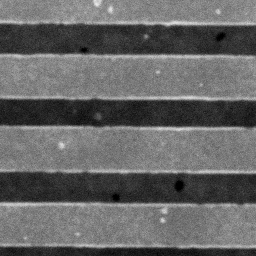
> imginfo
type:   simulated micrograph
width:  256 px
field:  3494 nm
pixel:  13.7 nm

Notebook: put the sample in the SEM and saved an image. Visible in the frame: lines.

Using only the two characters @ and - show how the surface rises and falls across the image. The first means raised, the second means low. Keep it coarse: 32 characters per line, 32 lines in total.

@@@@@@@@@@@@@@@@@@@@@@@@@@@@@@@@
@@@@@@@@@@@@@@@@@@@@@@@@@@@@@@@@
@@@@@@@@@@@@@@@@@@@@@@@@@@@@@@@@
--------------------------------
--------------------------------
--------------------------------
--------------------------------
@@@@@@@@@@@@@@@@@@@@@@@@@@@@@@@@
@@@@@@@@@@@@@@@@@@@@@@@@@@@@@@@@
@@@@@@@@@@@@@@@@@@@@@@@@@@@@@@@@
@@@@@@@@@@@@@@@@@@@@@@@@@@@@@@@@
@@@@@@@@@@@@@@@@@@@@@@@@@@@@@@@@
--------------------------------
--------------------------------
--------------------------------
--------------------------------
@@@@@@@@@@@@@@@@@@@@@@@@@@@@@@@@
@@@@@@@@@@@@@@@@@@@@@@@@@@@@@@@@
@@@@@@@@@@@@@@@@@@@@@@@@@@@@@@@@
@@@@@@@@@@@@@@@@@@@@@@@@@@@@@@@@
@@@@@@@@@@@@@@@@@@@@@@@@@@@@@@@@
-------------------@---@@@@@@@@@
--------------------------------
--------------------------------
--------------------------------
@@@@@@@@@@@@@-------------------
@@@@@@@@@@@@@@@@@@@@@@@@@@@@@@@@
@@@@@@@@@@@@@@@@@@@@@@@@@@@@@@@@
@@@@@@@@@@@@@@@@@@@@@@@@@@@@@@@@
@@@@@@@@@@@@@@@@@@@@@@@@@@@@@@@@
@@@@@@@@@@@@@@@@@@@@@@@@@@@@@@@@
--------------------------------